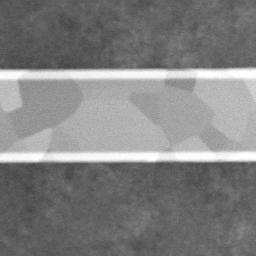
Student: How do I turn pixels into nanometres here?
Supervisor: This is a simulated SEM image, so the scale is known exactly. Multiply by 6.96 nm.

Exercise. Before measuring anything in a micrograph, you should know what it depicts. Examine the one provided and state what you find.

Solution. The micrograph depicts one or a few lines or trenches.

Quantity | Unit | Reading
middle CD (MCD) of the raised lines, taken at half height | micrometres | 0.576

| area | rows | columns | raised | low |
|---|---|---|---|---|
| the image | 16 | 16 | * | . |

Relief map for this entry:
................
................
................
................
................
****************
****************
****************
****************
****************
................
................
................
................
................
................